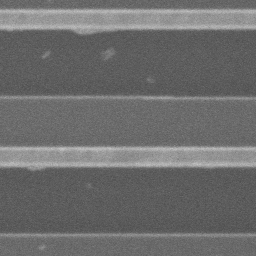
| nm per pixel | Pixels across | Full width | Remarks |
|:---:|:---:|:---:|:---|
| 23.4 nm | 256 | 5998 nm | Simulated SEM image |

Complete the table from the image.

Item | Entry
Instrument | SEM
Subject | lines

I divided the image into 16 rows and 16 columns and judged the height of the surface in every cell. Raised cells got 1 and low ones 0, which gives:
1111111111111111
1111111111111111
0000000000000000
0000000000000000
0000000000000000
0000000000000000
1111111111111111
1111111111111111
1111111111111111
1111111111111111
0010000000000000
0000000000000000
0000000000000000
0000000000000000
0000000000000000
1111111111111111